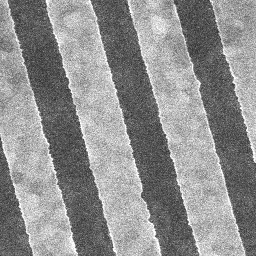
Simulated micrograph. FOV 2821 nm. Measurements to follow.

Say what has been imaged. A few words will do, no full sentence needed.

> one or a few lines or trenches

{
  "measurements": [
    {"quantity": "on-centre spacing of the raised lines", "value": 879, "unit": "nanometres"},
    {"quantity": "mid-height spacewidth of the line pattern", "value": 401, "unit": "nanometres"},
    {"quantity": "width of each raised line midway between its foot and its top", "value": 478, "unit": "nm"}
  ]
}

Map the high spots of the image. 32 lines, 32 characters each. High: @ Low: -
@-----@@@@@-----@@@@@@-----@@@@@
@-----@@@@@@----@@-@@@-----@@@@@
------@@@@@@-----@@@@@-----@@@@@
@@-----@@@@@-----@@@@@@----@@@@@
@@-----@@@@@@----@@@@@@-----@@@@
@@-----@@@@@@----@@--@@-----@@@@
@@@-----@@@@@-----@-@@@-----@@@@
@@@-----@@@@@-----@--@@@----@@@@
@@@-----@@@@@@----@@@@@@-----@@@
@@@-----@@-@@@-----@@@@@-----@@@
@@@@-----@@@@@-----@@@@@@----@@@
@@@@-----@@@@@-----@@@@@@----@@@
@@@@-----@@@@@@-----@@@@@-----@@
@@@@@-----@@@@@-----@@@@@-----@@
@@@@@-----@@@@@-----@@@@@@----@@
@@@@@-----@@@@@-----@@@@@@-----@
@@@@@-----@@@@@@-----@@@@@-----@
@@@@@@------@@@@-----@@@@@@----@
@@@@@@-----@@@-@-----@@@@@@----@
-@@@@@-----@@@--@----@@@@@@-----
-@@@@@@----@@@@@@-----@@@@@-----
-@@@@@@-----@@@-@-----@@@@@@----
--@@@@@-----@@@@@-----@@@@@@----
--@@@@@-----@@@@@@-----@@@@@----
--@@@@@@----@@@@@@-----@@@@@@---
---@@@@@-----@@@@@-----@@@@@@---
---@@@@@-----@@@@@@----@@@@@@---
---@@@@@@----@@@@@@-----@@@@@---
---@@@@@@-----@@@-@-----@@@@@@--
----@@@@@-----@@@@@-----@@@@@@--
----@@@@@-----@@@@@------@@@@@--
----@@@@@@----@@@@@@-----@@@@@@-